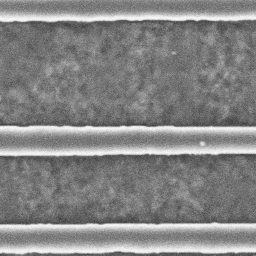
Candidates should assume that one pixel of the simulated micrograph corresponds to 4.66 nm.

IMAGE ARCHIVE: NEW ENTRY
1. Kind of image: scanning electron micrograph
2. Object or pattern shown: lines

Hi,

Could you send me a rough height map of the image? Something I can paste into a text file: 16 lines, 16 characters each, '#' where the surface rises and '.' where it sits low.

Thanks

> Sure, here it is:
################
................
................
................
................
................
................
................
################
################
................
................
................
................
################
################